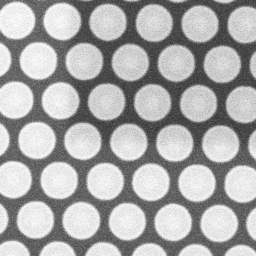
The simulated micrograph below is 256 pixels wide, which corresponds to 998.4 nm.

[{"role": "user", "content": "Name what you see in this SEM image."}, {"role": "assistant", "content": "an array of small figures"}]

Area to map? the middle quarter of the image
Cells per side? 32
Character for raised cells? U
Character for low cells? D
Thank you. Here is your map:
DUUUUUUUUDDDUUUUUUUUUDDDUUUUUUUU
DUUUUUUUUDDDUUUUUUUUUDDDUUUUUUUU
DDUUUUUUUDDDDUUUUUUUDDDDUUUUUUUU
DDDUUUUDDDDDDDUUUUUDDDDDDUUUUUUD
DDDDDDDDDDDDDDDDDDDDDDDDDDDDDDDD
UUDDDDDDDUUUUDDDDDDDUUUUDDDDDDDD
UUUDDDDUUUUUUUDDDDDUUUUUUDDDDDUU
UUUDDDDUUUUUUUUDDDUUUUUUUUDDDDUU
UUUUDDUUUUUUUUUDDDUUUUUUUUUDDUUU
UUUUDDUUUUUUUUUDDDUUUUUUUUUDDUUU
UUUUDDUUUUUUUUUDDDUUUUUUUUUDDUUU
UUUDDDUUUUUUUUUDDDUUUUUUUUDDDUUU
UUDDDDDUUUUUUUDDDDDUUUUUUUDDDDUU
UDDDDDDDUUUUUDDDDDDDUUUUUDDDDDDU
DDDDDDDDDDDDDDDDDDDDDDDDDDDDDDDD
DDUUUUUDDDDDDDUUUUDDDDDDDDUUUDDD
DUUUUUUUDDDDDUUUUUUUDDDDUUUUUUUD
UUUUUUUUUDDDUUUUUUUUDDDUUUUUUUUU
UUUUUUUUUDDDUUUUUUUUUDDUUUUUUUUU
UUUUUUUUUDDDUUUUUUUUUDDUUUUUUUUU
UUUUUUUUUDDDUUUUUUUUUDDUUUUUUUUU
DUUUUUUUUDDDUUUUUUUUDDDUUUUUUUUU
DUUUUUUUDDDDDUUUUUUUDDDDUUUUUUUD
DDDUUUUDDDDDDDUUUUUDDDDDDUUUUUUD
DDDDDDDDDDDDDDDDDDDDDDDDDDDDDDDD
UDDDDDDDUUUUUDDDDDDDUUUUDDDDDDDD
UUDDDDDUUUUUUUDDDDUUUUUUUDDDDDUU
UUUDDDUUUUUUUUUDDDUUUUUUUUDDDUUU
UUUDDDUUUUUUUUUDDUUUUUUUUUDDDUUU
UUUDDDUUUUUUUUUDDUUUUUUUUUDDDUUU
UUUDDDUUUUUUUUUDDUUUUUUUUUDDDUUU
UUUDDDUUUUUUUUDDDDUUUUUUUUDDDUUU